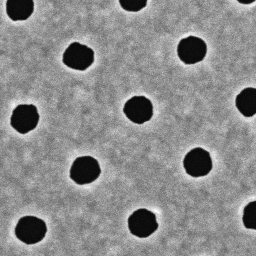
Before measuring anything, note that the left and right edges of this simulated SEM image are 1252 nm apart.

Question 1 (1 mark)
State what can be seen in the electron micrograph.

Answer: a regular array of holes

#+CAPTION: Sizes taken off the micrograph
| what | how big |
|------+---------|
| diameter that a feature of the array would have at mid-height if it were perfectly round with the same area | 144 nm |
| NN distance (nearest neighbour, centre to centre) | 388 nanometers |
